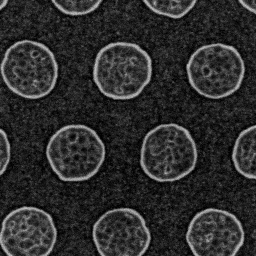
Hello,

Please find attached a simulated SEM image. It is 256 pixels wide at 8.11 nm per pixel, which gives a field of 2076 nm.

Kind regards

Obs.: raised bodies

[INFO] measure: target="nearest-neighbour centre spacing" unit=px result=92.6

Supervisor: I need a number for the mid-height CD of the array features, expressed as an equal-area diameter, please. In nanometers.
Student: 448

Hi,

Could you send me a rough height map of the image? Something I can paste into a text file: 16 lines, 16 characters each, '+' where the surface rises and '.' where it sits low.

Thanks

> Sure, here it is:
....++....++....
................
................
+++...+++...+++.
+++...+++...+++.
.++...+++...+++.
................
................
...+++...+++...+
+..+++...+++...+
...+++...+++...+
................
................
.++...+++...++..
+++...+++...+++.
+++...+++...+++.